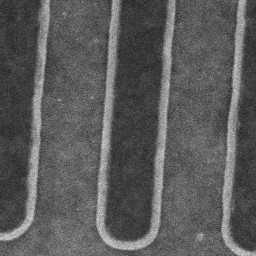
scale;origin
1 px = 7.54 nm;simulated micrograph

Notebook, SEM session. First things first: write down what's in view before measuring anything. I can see one or a few lines or trenches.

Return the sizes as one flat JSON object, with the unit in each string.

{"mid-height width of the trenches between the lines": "0.519 um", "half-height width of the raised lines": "0.424 µm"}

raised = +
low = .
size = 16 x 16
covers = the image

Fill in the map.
+++....++++....+
+++....++++....+
+++....++++....+
+++....+++.....+
+++....+++.....+
++.....+++.....+
++.....+++.....+
++.....+++....++
++.....+++....++
++.....+++....++
++....++++....++
++....++++....++
++....++++....++
++....++++....++
+.....++++....++
...............+